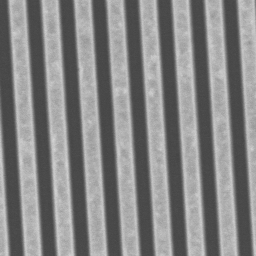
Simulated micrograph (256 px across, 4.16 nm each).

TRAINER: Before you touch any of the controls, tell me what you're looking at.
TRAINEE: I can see parallel lines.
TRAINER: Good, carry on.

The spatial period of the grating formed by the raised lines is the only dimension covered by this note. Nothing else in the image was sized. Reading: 32.7 pixels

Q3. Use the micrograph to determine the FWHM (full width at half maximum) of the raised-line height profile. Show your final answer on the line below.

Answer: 71.7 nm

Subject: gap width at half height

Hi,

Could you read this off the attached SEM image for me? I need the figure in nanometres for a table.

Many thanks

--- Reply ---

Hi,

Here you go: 64.4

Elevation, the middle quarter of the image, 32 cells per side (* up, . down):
....****....****....****....****
....****....****....****....****
....****....****....****....****
....****....****....****....****
....****....****....****....****
....****....****....****....****
....****....****....****.....***
....****....****....****.....***
....****....****....*****....***
....****....****.....****....***
....****....****.....****....***
....****....*****....****....***
....****....*****....****....***
....****.....****....****....***
*...*****....****....****....***
*...*****....****....****....***
*....****....****....****....***
*....****....****....****....***
*....****....****....****....***
*....****....****....****....***
*....****....****....****....***
*....****....****....****....***
*....****....****....****.....**
*....****....****....****.....**
*....****....****....*****....**
*....****....****....*****....**
*....****....****.....****....**
*....*****...*****....****....**
*....****....*****....****....**
*....****.....****....****....**
**...*****....****....****....**
**...*****....****....****....**